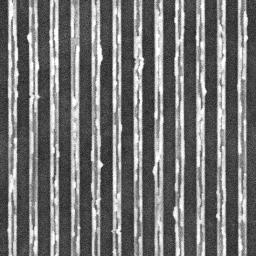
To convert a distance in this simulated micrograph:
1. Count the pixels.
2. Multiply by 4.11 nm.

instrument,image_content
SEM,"parallel lines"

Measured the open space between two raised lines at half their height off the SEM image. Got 54.9 nanometers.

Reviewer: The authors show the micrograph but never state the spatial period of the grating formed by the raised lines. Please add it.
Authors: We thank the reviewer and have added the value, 85.6 nanometres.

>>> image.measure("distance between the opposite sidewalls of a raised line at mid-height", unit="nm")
31.8